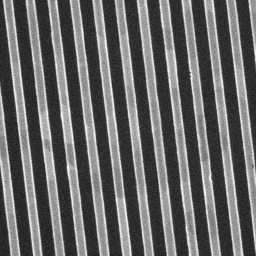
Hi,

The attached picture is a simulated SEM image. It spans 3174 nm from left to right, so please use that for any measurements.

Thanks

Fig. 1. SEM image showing parallel lines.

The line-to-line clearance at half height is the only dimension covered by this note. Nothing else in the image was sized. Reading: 166 nanometres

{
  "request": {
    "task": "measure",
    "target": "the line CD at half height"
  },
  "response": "111 nm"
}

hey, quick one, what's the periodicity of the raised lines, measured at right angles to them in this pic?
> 0.275 um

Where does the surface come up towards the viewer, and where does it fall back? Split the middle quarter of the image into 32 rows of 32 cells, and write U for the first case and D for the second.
DDDDUUDDDUUDDDDUUDDDUUDDDDUUDDDU
DDDDUUDDDUUDDDDUUDDDUUDDDDUUDDDU
DDDDUUDDDUUDDDDUUDDDDUUDDDUUDDDD
DDDDUUDDDDUDDDDUUDDDDUUDDDUUDDDD
UDDDUUDDDDUUDDDUUDDDDUUDDDUUDDDD
UDDDUUDDDDUUDDDUUDDDDUUDDDUUUDDD
UDDDUUDDDDUUDDDDUDDDDUUDDDDUUDDD
UDDDUUUDDDUUDDDDUUDDDUUDDDDUUDDD
UDDDDUUDDDUUDDDDUUDDDUUDDDDUUDDD
UDDDDUUDDDUUDDDDUUDDDUUDDDDUUDDD
UDDDDUUDDDUUDDDDUUDDDUUUDDDUUDDD
UDDDDUUDDDDUDDDDUUDDDDUUDDDUUDDD
UDDDDUUDDDDUUDDDUUDDDDUUDDDUUDDD
UUDDDUUDDDDUUDDDUUDDDDUUDDDUUUDD
UUDDDUUDDDDUUDDDUUDDDDUUDDDDUUDD
UUDDDUUDDDDUUDDDUUUDDDUUDDDDUUDD
UUDDDUUUDDDUUDDDDUUDDDUUDDDDUUDD
UUDDDDUUDDDUUDDDDUUDDDUUDDDDUUDD
UUDDDDUUDDDUUDDDDUUDDDUUDDDDUUDD
UUDDDDUUDDDUUDDDDUUDDDDUUDDDUUDD
UUDDDDUUDDDDUDDDDUUDDDDUUDDDUUDD
UUUDDDUUDDDDUUDDDUUDDDDUUDDDUUDD
DUUDDDUUDDDDUUDDDUUDDDDUUDDDUUUD
DUUDDDUUDDDDUUDDDUUDDDDUUDDDDUUD
DUUDDDUUUDDDUUDDDUUUDDDUUDDDDUUD
DUUDDDDUUDDDUUDDDDUUDDDUUDDDDUUD
DUUDDDDUUDDDUUDDDDUUDDDUUDDDDUUD
DUUDDDDUUDDDUUDDDDUUDDDUUUDDDUUD
DUUDDDDUUDDDDUDDDDUUDDDDUUDDDUUD
DUUDDDDUUDDDDUUDDDUUDDDDUUDDDUUD
DDUUDDDUUDDDDUUDDDUUDDDDUUDDDUUU
DDUUDDDUUDDDDUUDDDUUDDDDUUDDDUUU